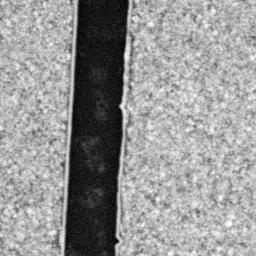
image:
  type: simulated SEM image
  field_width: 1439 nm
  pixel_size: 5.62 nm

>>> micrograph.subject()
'one or a few lines or trenches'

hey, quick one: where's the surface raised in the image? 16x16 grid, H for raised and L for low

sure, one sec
HHHHHLLLHHHHHHHH
HHHHHLLLHHHHHHHH
HHHHHLLLHHHHHHHH
HHHHHLLLHHHHHHHH
HHHHHLLLHHHHHHHH
HHHHLLLLHHHHHHHH
HHHHLLLLHHHHHHHH
HHHHLLLLHHHHHHHH
HHHHLLLLHHHHHHHH
HHHHLLLLHHHHHHHH
HHHHLLLLHHHHHHHH
HHHHLLLHHHHHHHHH
HHHHLLLHHHHHHHHH
HHHHLLLHHHHHHHHH
HHHHLLLHHHHHHHHH
HHHHLLLHHHHHHHHH